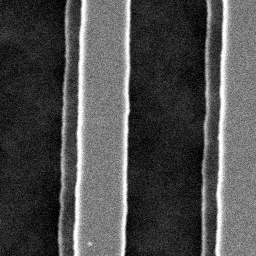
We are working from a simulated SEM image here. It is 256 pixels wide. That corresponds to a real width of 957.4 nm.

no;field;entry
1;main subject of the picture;lines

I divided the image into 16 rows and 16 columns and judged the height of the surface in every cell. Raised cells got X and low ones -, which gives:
-----XXX------XX
-----XXX------XX
-----XXX------XX
-----XXX------XX
-----XXX------XX
-----XXX------XX
-----XXX------XX
-----XXX------XX
-----XXX------XX
-----XXX------XX
-----XXX------XX
-----XXX------XX
-----XXX------XX
-----XXX------XX
-----XXX------XX
-----XXX------XX